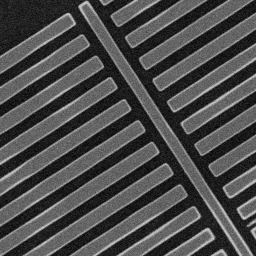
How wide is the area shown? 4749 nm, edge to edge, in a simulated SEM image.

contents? groups of lines, slits or small figures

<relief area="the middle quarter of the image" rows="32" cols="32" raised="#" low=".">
....######...###....##......####
..#######.....###.........######
.######........###......#######.
######.....#...###.....######...
####......##....###...######....
###.....#####...####...###......
#......######....###....#.....##
.....######.......###.......####
....######.........###.....#####
..######......##...###....######
.######.....####....###...####..
#####......#####....###....#....
####.....#######.....###........
##.....#######........###......#
......######......#...####....##
....#######.....####...###....##
...######......#####....###...##
.#######.....######.....###.....
######......######.......###....
####......######..........###...
###......######.....###...###...
##.....######......####....###..
.....#######.....######....####.
....######......######......###.
..#######.....#######........###
.######.....#######.....##...###
######.....######......####...##
####......######.....######....#
###.....######......######.....#
#.....#######.....#######.......
....#######.....#######.....#...
...#######.....######......###..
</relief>